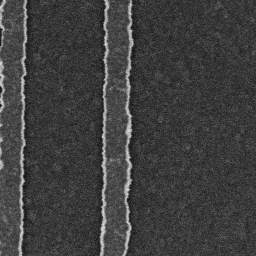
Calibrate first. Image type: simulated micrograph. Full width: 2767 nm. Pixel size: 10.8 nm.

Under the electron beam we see one or a few lines or trenches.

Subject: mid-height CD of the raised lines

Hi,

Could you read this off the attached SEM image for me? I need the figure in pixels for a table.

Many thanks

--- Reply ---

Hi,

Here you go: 24